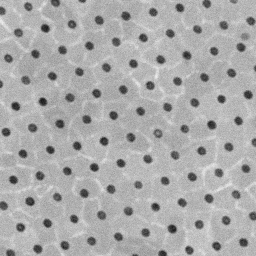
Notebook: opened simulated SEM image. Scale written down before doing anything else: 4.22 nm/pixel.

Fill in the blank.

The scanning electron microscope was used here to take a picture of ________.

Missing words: a regular array of holes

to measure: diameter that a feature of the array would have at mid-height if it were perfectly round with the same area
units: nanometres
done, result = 40.4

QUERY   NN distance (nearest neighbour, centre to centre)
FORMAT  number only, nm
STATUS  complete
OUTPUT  114